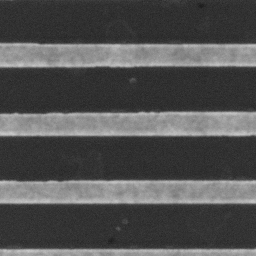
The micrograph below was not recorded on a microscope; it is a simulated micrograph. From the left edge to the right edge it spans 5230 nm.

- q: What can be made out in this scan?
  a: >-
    lines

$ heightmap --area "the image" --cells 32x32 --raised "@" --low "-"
--------------------------------
--------------------------------
--------------------------------
--------------------------------
--------------------------------
--------------------------------
@@@@@@@@@@@@@@@@@@@@@@@@@@@@@@@@
@@@@@@@@@@@@@@@@@@@@@@@@@@@@@@@@
--------------------------------
--------------------------------
--------------------------------
--------------------------------
--------------------------------
--------------------------------
@@@@@@@@@@@@@@@@@@@@@@@@@@@@@@@@
@@@@@@@@@@@@@@@@@@@@@@@@@@@@@@@@
@@@@@@@@@@@@@@@@@@@@@@@@@@@@@@@@
--------------------------------
--------------------------------
--------------------------------
--------------------------------
--------------------------------
--------------------------------
@@@@@@@@@@@@@@@@@@@@@@@@@@@@@@@@
@@@@@@@@@@@@@@@@@@@@@@@@@@@@@@@@
--------------------------------
--------------------------------
--------------------------------
--------------------------------
--------------------------------
--------------------------------
@@@@@@@@@@@@@@@@@@@@@@@@@@@@@@@@